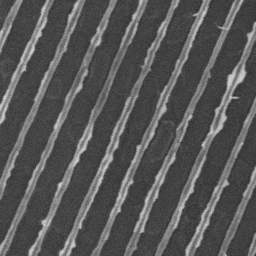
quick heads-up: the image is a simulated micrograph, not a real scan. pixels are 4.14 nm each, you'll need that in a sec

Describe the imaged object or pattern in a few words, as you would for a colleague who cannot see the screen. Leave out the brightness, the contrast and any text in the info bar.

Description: parallel lines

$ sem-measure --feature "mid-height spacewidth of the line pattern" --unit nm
87.7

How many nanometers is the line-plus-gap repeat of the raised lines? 119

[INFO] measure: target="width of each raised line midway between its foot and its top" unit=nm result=31.3